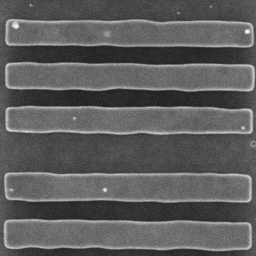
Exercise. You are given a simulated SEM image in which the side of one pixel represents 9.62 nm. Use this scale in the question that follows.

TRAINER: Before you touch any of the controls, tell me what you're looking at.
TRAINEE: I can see groups of lines, slits or small figures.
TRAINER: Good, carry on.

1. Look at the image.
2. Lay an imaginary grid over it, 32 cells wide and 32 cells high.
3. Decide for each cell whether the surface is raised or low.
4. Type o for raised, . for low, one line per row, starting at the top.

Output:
................................
................................
................................
.ooooooooooooooooooooooooooooooo
.ooooooooooooooooooooooooooooooo
.ooooooooooooooooooooooooooooooo
................................
................................
.ooooooooooooooooooooooooooooooo
.ooooooooooooooooooooooooooooooo
.ooooooooooooooooooooooooooooooo
................................
................................
..ooooooooooo.....oooooo........
.oooooooooooooooooooooooooooooo.
.oooooooooooooooooooooooooooooo.
..ooooo.ooooooooooooooooooooooo.
................................
................................
................................
................................
................................
.oooooooooooooooooooooooooooooo.
.oooooooooooooooooooooooooooooo.
.oooooooooooooooooooooooooooooo.
................................
................................
................................
.oooooooooooooooooooooooooooooo.
.oooooooooooooooooooooooooooooo.
.oooooooooooooooooooooooooooooo.
................................